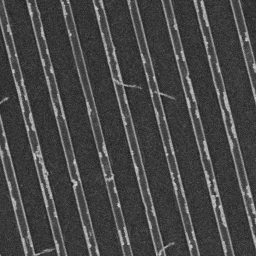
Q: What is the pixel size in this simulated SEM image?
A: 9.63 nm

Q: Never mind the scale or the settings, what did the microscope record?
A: parallel lines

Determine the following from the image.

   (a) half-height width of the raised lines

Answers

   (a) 0.0771 micrometres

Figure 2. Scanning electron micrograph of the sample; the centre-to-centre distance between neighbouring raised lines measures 312 nanometers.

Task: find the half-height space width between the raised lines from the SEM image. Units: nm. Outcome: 232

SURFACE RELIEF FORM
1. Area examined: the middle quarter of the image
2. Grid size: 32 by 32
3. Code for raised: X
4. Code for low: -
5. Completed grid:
---XX------XX-------XX------XXX-
---XX-------XX------XX-------XX-
----XX------XX------XX-------XX-
----XX------XX-------XX------XX-
----XX------XX-------XX------XXX
-----X-------XX------XX-------XX
-----XX------XX------XX-------XX
-----XX------XX-------XX------XX
-----XX------XX-------XX------XX
------XX------XX------XX-------X
------XX------XX------XX-------X
------XX------XX-------XX------X
------XX------XX-------XX------X
------XXX------XX------XX-------
-------XX------XX------XX-------
X------XX------XX-------XX------
X------XX------XX-------XX------
X------XXX------XX------XX------
X-------XX------XX------XX------
XX------XX------XX-------XX-----
XX------XX------XX-------XX-----
XX------XX-------XX------XX-----
XX-------XX------XX------XXX----
XXX------XX------XX-------XX----
-XX------XX------XX-------XX----
-XX------XX-------XX------XX----
-XX-------XX------XX------XX----
-XXX------XX------XX-------XX---
--XX------XX------XX-------XX---
--XX------XX-------XX------XX---
--XX-------XX------XX------XX---
---XX------XX------XX-------XX--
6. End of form